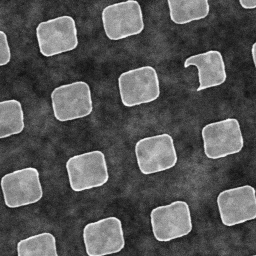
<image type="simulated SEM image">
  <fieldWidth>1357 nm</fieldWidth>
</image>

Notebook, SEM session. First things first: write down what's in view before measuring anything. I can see a regular array of raised bodies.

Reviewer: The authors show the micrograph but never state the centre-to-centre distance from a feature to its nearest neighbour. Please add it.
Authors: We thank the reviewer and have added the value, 362 nanometres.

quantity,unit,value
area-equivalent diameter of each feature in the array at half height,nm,211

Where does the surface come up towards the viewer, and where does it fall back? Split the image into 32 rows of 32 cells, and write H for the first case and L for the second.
LLLLLLLLLLLLLLLHHLLLLHHHHHLLLLHH
LLLLLLLLLLLLLHHHHHLLLHHHHHLLLLLL
LLLLLLLHHLLLLHHHHHLLLLHHLLLLLLLL
LLLLLHHHHLLLLHHHHHLLLLLLLLLLLLLL
HLLLLHHHHHLLLLHHLLLLLLLLLLLLLLLL
HLLLLHHHHHLLLLLLLLLLLLLLLLLLLLLL
HLLLLHHHLLLLLLLLLLLLLLLLLLHLLLLL
HLLLLLLLLLLLLLLLLLLLLLLHHHHHLLLL
LLLLLLLLLLLLLLLLLLHLLLLLLHHHLLLL
LLLLLLLLLLLLLLLHHHHHLLLLLHHHLLLL
LLLLLLLLLHHLLLLHHHHHLLLLLHHLLLLL
LLLLLLLHHHHLLLLHHHHHLLLLLLLLLLLL
LLLLLLLHHHHLLLLHHHHLLLLLLLLLLLLL
HHHLLLLHHHHLLLLLLLLLLLLLLLLLLLLL
HHHLLLLHHHHLLLLLLLLLLLLLLLLLLLLL
HHHLLLLLLLLLLLLLLLLLLLLLLLHHHHLL
HHLLLLLLLLLLLLLLLLLLLLLLLHHHHHLL
LLLLLLLLLLLLLLLLLLHHHLLLLHHHHHLL
LLLLLLLLLLLLLLLLLHHHHHLLLLHHHHLL
LLLLLLLLLLHHHLLLLHHHHHLLLLHHLLLL
LLLLLLLLHHHHHLLLLHHHHHLLLLLLLLLL
LLHHHLLLLHHHHLLLLLHLLLLLLLLLLLLL
HHHHHLLLLHHHHLLLLLLLLLLLLLLLLLLL
HHHHHLLLLHHLLLLLLLLLLLLLLLLLLLHL
LHHHHLLLLLLLLLLLLLLLLLLLLLLHHHHH
LHHLLLLLLLLLLLLLLLLLLHHLLLLHHHHH
LLLLLLLLLLLLLLLLLLLHHHHHLLLLHHHH
LLLLLLLLLLLLLHHLLLLHHHHHLLLLHHHL
LLLLLLLLLLLHHHHLLLLHHHHHLLLLLLLL
LLLLHHLLLLHHHHHLLLLHHHHLLLLLLLLL
LLHHHHHLLLLHHHHLLLLLLLLLLLLLLLLL
LLHHHHHLLLLHHHHLLLLLLLLLLLLLLLLL